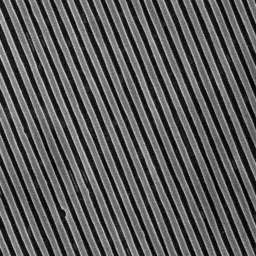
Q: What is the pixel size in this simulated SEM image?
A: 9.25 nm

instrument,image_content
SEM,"parallel lines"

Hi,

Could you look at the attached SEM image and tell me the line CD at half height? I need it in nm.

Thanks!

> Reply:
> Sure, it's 55.7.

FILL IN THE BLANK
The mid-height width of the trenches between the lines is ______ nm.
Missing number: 54.7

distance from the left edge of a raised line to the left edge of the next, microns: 0.11